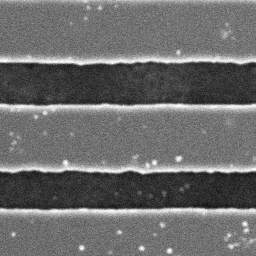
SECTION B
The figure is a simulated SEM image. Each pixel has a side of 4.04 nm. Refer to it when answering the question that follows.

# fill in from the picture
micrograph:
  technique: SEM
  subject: lines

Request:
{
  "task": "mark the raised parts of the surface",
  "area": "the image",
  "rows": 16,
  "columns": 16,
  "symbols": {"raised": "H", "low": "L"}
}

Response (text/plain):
HHHHHHHHHHHHHHHH
HHHHHHHHHHHHHHHH
HHHHHHHHHHHHHHHH
HHHHHHHHHHHHHHHH
LLLLLLLLLLLLLLLL
LLLLLLLLLLLLLLLL
LLLLLLLLLLLLLLLL
HHHHHHHHHHHHHHHH
HHHHHHHHHHHHHHHH
HHHHHHHHHHHHHHHH
HHHHHHHHHHHHHHHH
LLLLLLLLLLLLLLLL
LLLLLLLLLLLLLLLL
HHHHHHHHHHHHHHHH
HHHHHHHHHHHHHHHH
HHHHHHHHHHHHHHHH